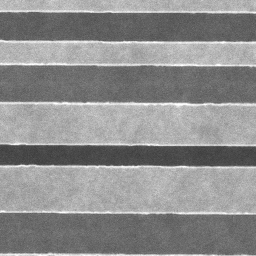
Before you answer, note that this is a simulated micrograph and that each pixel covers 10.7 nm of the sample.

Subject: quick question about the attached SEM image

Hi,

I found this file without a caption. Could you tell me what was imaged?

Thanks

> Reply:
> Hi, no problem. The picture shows lines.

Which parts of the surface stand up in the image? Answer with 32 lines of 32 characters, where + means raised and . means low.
++++++++++++++++++++++++++++++++
...........+++++++++++++++++++++
................................
................................
................................
++++++++++++++++++++++++++++++++
++++++++++++++++++++++++++++++++
++++++++++++++++++++++++++++++++
................................
................................
................................
................................
................................
++++++++++++++++++++++++++++++++
++++++++++++++++++++++++++++++++
++++++++++++++++++++++++++++++++
++++++++++++++++++++++++++++++++
++++++++++++++++++++++++++++++++
................................
................................
................................
++++++++++++++++++++++++++++++++
++++++++++++++++++++++++++++++++
++++++++++++++++++++++++++++++++
++++++++++++++++++++++++++++++++
++++++++++++++++++++++++++++++++
.......+..++++++++++++++++++++++
................................
................................
................................
................................
................................